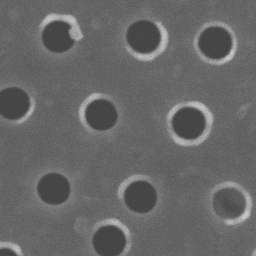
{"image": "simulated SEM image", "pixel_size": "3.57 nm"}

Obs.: holes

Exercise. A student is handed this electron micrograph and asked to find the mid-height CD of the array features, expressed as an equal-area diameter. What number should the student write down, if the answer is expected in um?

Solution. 0.119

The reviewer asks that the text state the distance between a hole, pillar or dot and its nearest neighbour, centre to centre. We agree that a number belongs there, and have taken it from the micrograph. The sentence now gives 307 nm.